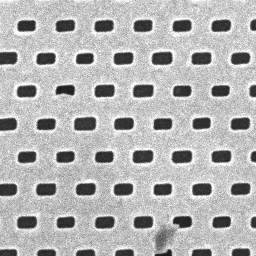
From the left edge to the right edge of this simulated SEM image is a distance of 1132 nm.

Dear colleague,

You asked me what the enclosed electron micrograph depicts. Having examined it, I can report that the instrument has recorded a regular array of holes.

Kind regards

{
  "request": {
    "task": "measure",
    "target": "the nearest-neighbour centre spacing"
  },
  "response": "167 nm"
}